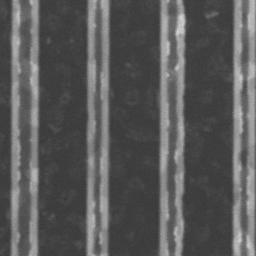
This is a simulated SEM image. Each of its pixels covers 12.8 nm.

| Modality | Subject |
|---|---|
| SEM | one or a few lines or trenches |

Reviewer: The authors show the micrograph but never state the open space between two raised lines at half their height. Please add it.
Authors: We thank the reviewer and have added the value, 0.714 microns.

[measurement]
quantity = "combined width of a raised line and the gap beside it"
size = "0.936 microns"